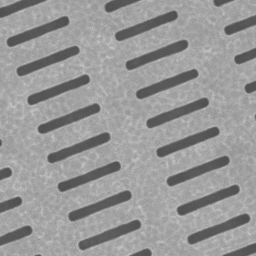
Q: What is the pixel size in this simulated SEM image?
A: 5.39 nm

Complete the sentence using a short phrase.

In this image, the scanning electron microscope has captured a regular array of holes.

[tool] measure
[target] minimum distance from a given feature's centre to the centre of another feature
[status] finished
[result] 166 nm